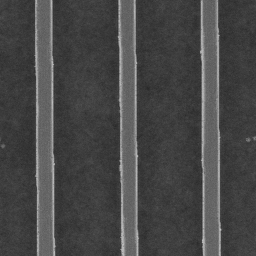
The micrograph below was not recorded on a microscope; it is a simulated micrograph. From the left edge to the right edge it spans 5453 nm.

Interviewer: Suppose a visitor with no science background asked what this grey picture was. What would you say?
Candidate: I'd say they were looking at lines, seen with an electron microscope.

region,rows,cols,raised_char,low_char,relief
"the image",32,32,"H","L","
LLLLHHLLLLLLLLLHHLLLLLLLLHHLLLLL
LLLLHHLLLLLLLLLHHLLLLLLLLHHLLLLL
LLLLHHLLLLLLLLLHHLLLLLLLLHHLLLLL
LLLLHHLLLLLLLLLHHLLLLLLLLHHLLLLL
LLLLHHLLLLLLLLLHHLLLLLLLLHHLLLLL
LLLLHHLLLLLLLLLHHLLLLLLLLHHLLLLL
LLLLHHLLLLLLLLLHHLLLLLLLLHHLLLLL
LLLLLHHLLLLLLLLHHLLLLLLLLHHLLLLL
LLLLLHHLLLLLLLLHHLLLLLLLLHHLLLLL
LLLLLHHLLLLLLLLHHLLLLLLLLHHLLLLL
LLLLLHHLLLLLLLLHHLLLLLLLLHHLLLLL
LLLLLHHLLLLLLLLHHLLLLLLLLHHLLLLL
LLLLLHHLLLLLLLLHHLLLLLLLLHHLLLLL
LLLLLHHLLLLLLLLHHLLLLLLLLHHLLLLL
LLLLLHHLLLLLLLLHHLLLLLLLLHHLLLLL
LLLLLHHLLLLLLLLHHLLLLLLLLHHLLLLL
LLLLLHHLLLLLLLLHHLLLLLLLLHHLLLLL
LLLLLHHLLLLLLLLHHLLLLLLLLHHLLLLL
LLLLLHHLLLLLLLLHHLLLLLLLLHHLLLLL
LLLLLHHLLLLLLLLHHLLLLLLLLHHLLLLL
LLLLLHHLLLLLLLLHHLLLLLLLLHHLLLLL
LLLLLHHLLLLLLLLHHLLLLLLLLHHLLLLL
LLLLLHHLLLLLLLLHHLLLLLLLLHHLLLLL
LLLLLHHLLLLLLLLHHLLLLLLLLHHLLLLL
LLLLLHHLLLLLLLLHHLLLLLLLLHHLLLLL
LLLLLHHLLLLLLLLHHLLLLLLLLHHLLLLL
LLLLLHHLLLLLLLLHHLLLLLLLLHHLLLLL
LLLLLHHLLLLLLLLHHLLLLLLLLHHLLLLL
LLLLLHHLLLLLLLLHHLLLLLLLLHHHLLLL
LLLLLHHLLLLLLLLHHLLLLLLLLHHHLLLL
LLLLLHHLLLLLLLLHHLLLLLLLLHHHLLLL
LLLLLHHLLLLLLLLHHLLLLLLLLLHHLLLL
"